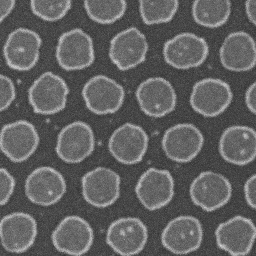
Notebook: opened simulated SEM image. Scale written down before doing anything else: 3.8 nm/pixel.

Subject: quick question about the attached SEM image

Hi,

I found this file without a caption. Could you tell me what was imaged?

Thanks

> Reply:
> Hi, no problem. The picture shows a regular array of raised bodies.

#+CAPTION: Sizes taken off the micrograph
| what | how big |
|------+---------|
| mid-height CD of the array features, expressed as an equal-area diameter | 141 nm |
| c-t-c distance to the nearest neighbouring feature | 199 nm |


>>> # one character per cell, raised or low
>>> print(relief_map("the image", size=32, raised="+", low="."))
++..+++++..+++++..++++..+++++..+
+...++++...++++...++++..+++++..+
............++....+++....+++...+
................................
.++++...+++....+++....++.....++.
.++++..++++...++++...+++++..++++
.++++..+++++..++++...+++++..++++
.+++...++++...++++...++++...++++
..++....+......+.............++.
.....++.........................
+...++++...++++...+++....+++....
++..++++..+++++..+++++..+++++..+
+...++++...++++..+++++..+++++..+
....++++...++++...++++..++++...+
................................
..+.............................
++++....+++...++++...++++...++++
+++++..+++++..++++..+++++...++++
++++...+++++..++++...++++...++++
.++.....+++...++++...+++....++++
................................
+...+++.....++....++............
++.+++++..+++++...+++....+++...+
+..+++++..+++++..++++...+++++..+
+..+++++...++++..++++...+++++..+
.....+......++....++.....+++...+
................................
++++....++.....++.....++.....++.
++++...++++...++++...++++..+++++
++++...++++..+++++..+++++..+++++
++++...++++...++++...++++..++++.
........++.....++.....+......++.